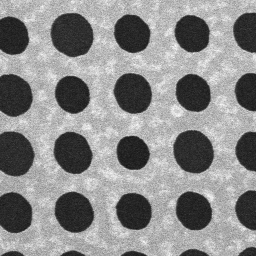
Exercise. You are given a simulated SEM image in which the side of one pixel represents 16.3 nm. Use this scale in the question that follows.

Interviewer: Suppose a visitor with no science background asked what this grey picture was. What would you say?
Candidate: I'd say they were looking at a regular array of holes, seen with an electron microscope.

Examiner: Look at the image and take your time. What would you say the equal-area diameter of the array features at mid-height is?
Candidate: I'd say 616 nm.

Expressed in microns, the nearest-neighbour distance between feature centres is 0.962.